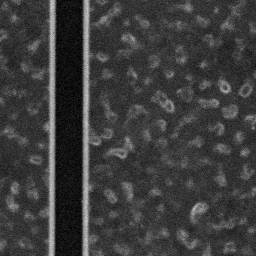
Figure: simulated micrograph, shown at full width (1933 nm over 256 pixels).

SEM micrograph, one or a few lines or trenches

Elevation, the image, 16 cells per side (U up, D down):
UUUDDUUUUUUUUUUU
UUUDDUUUUUUUUUUU
UUUDDUUUUUUUUUUU
UUUDDUUUUUUUUUUU
UUUDDUUUUUUUUUUU
UUUDDUUUUUUUUUUU
UUUDDUUUUUUUUUUU
UUUDDUUUUUUUUUUU
UUUDDUUUUUUUUUUU
UUUDDUUUUUUUUUUU
UUUDDUUUUUUUUUUU
UUUDDUUUUUUUUUUU
UUUDDUUUUUUUUUUU
UUUDDUUUUUUUUUUU
UUUDDUUUUUUUUUUU
UUUDDUUUUUUUUUUU